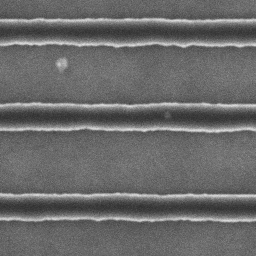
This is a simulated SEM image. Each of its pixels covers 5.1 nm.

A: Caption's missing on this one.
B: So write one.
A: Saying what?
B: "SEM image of lines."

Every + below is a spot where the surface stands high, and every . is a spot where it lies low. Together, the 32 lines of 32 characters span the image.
................................
................................
++++++++++++++++++++++++..++++++
++++++++++++++++++++++++++++++++
++++++++++++++++++++++++++++++++
++++++.+++++++++++++++++++++++++
................................
................................
................................
................................
................................
................................
................................
++++++++++++++++++++++++++++++++
++++++++++++++++++++++++++++++++
++++++++++++++++++++++++++++++++
................................
................................
................................
................................
................................
................................
................................
................................
++++++++++++++++++++.+++++++++++
++++++++++++++++++++++++++++++++
++++++++++++++++++++++++++++++++
..++++......+...+++++...++++++++
................................
................................
................................
................................